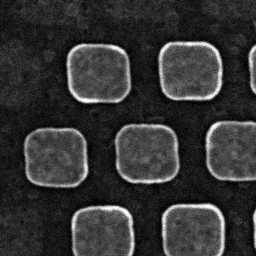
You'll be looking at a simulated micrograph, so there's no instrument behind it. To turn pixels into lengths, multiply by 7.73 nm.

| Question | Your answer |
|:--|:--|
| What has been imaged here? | raised bodies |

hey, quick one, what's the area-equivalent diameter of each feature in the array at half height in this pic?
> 64 px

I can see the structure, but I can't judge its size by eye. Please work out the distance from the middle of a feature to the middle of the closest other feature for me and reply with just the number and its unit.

0.705 microns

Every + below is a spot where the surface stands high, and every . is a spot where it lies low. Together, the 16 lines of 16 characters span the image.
................
................
................
....++++..++++..
....++++..++++..
....++++..++++..
................
................
..+++..++++..+++
..+++..++++..+++
..+++..++++..+++
..+++...........
................
.....+++..++++..
.....+++..++++..
.....+++..++++..